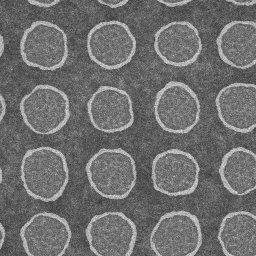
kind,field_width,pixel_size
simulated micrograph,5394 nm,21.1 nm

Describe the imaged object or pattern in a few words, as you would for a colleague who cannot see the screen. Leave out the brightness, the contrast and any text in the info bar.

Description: a regular array of raised bodies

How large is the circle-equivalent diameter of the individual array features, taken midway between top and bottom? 45.8 px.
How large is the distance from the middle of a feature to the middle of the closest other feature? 1340 nm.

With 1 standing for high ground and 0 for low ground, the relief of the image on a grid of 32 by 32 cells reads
00000100000001100000010000000000
00000000000000000000000000000000
00000000000000000000000000000000
00001110000011110000011100001111
00011111000111110000111110001111
00011111000111111000111110011111
00011111000111111000111110001111
00011111000011110000011100001111
00000000000000000000000000000000
00000000000000000000000000000000
00000000000000000000000000000000
00001111000011100000111100001111
00011111000111110000111110011111
10011111000111110001111110011111
00011111000111111000111110001111
00011111000011110000111100001111
00000100000000000000000000000000
00000000000000000000000000000000
00000000000000000000000000000000
00011111000011110000111000001111
00011111000111111001111110001111
00011111000111111001111110001111
00011111000111111001111110001111
00011111000011110000111100000111
00001110000001100000000000000000
00000000000000000000000000000000
00000000000000000000000000000000
00001111000011110000111100001111
00011111000111111001111110001111
00011111100111111001111110011111
00011111000111110001111110001111
00001111000011110000111100001111